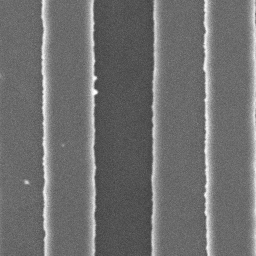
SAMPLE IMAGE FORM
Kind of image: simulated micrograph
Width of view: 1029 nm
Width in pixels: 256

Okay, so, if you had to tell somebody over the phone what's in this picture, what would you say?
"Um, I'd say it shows lines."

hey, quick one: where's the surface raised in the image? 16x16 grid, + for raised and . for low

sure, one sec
++++++....++++++
++++++....++++++
++++++....++++++
++++++....++++++
++++++....++++++
++++++....++++++
++++++....++++++
++++++....++++++
++++++....++++++
++++++....++++++
++++++....++++++
++++++....++++++
++++++....++++++
++++++....++++++
++++++....++++++
++++++....++++++